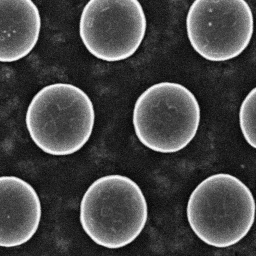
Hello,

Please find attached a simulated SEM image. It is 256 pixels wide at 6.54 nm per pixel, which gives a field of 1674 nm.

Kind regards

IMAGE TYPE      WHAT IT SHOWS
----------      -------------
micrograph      raised bodies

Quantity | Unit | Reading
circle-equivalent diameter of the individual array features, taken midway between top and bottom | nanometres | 442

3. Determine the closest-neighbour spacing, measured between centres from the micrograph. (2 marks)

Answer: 696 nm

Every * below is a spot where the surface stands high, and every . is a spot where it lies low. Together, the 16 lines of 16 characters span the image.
**...****...****
**...****...****
**...****...****
*.....**.....**.
................
...**....**.....
..****...***...*
..****..****...*
..****...***...*
...*............
................
**....**.....**.
**...****...****
**...****...****
**...****...***.
................